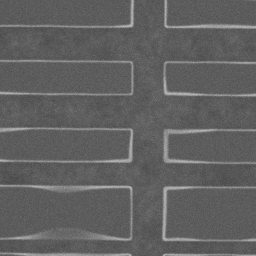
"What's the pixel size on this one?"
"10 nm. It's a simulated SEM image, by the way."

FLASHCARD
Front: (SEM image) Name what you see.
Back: groups of lines, slits or small figures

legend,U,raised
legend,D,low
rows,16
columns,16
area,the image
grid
UUUUUUUUDDUUUUUU
UUUUUUUUDDDUUUUU
DDDDDDDDDDDDDDDD
DDDDDDDDDDDDDDDD
UUUUUUUUDDUUUUUU
UUUUUUUUDDUUUUUU
DDDDDDDDDDDDDDDD
DDDDDDDDDDDDDDDD
UUUUUUUUDDDUUUUU
UUUUUUUUDDUUUUUU
DDDDDDDDDDDDDDDD
DDDDDDDDDDDDDDDD
UUUUUUUUDDUUUUUU
UUUUUUUUDDUUUUUU
UUUUUUUUDDUUUUUU
DDDDDDDDDDDDDDDD